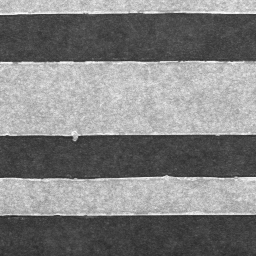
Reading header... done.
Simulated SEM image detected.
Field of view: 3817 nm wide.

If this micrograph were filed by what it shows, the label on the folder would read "one or a few lines or trenches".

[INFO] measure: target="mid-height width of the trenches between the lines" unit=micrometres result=0.69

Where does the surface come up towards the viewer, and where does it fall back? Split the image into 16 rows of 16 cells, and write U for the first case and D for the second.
UUUUUUUUUUUUUUUU
DDDDDDDDDDDDDDDD
DDDDDDDDDDDDDDDD
DDDDDDDDDDDDDDDD
UUUUUUUUUUUUUUUU
UUUUUUUUUUUUUUUU
UUUUUUUUUUUUUUUU
UUUUUUUUUUUUUUUU
DDDDUDDDDDDDDDDD
DDDDDDDDDDDDDDDD
DDDDDDDDDDDDDDDD
UUUUUUUUUUUUUUUU
UUUUUUUUUUUUUUUU
DDDDDDDDDDDDDDDD
DDDDDDDDDDDDDDDD
DDDDDDDDDDDDDDDD